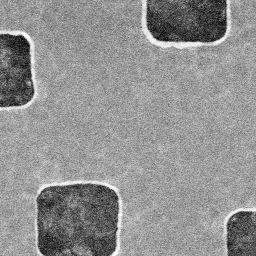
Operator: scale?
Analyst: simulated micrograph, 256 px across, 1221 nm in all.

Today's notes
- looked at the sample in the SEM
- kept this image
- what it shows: holes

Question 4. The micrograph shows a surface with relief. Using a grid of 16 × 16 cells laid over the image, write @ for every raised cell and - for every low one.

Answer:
@@@@@@@@@-----@@
@@@@@@@@@-----@@
--@@@@@@@@----@@
--@@@@@@@@@@@@@@
--@@@@@@@@@@@@@@
--@@@@@@@@@@@@@@
--@@@@@@@@@@@@@@
@@@@@@@@@@@@@@@@
@@@@@@@@@@@@@@@@
@@@@@@@@@@@@@@@@
@@@@@@@@@@@@@@@@
@@@@--@@@@@@@@@@
@@-----@@@@@@@@@
@@-----@@@@@@@--
@@-----@@@@@@@--
@@-----@@@@@@@--